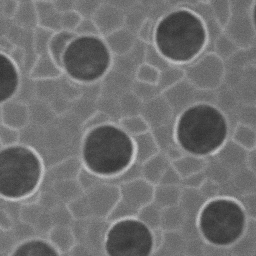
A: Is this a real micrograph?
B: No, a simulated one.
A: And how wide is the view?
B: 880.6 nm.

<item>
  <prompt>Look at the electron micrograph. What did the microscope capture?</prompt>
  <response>holes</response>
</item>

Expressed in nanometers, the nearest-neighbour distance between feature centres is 326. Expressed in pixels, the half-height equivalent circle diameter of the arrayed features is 48.7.